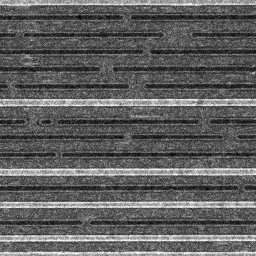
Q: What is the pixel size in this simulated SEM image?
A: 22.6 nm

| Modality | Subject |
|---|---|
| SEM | parallel lines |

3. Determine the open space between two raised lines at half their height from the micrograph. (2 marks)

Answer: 271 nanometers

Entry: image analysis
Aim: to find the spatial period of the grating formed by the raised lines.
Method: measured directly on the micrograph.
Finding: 383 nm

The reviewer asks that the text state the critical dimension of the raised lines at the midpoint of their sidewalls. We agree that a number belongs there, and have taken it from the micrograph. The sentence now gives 116 nm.